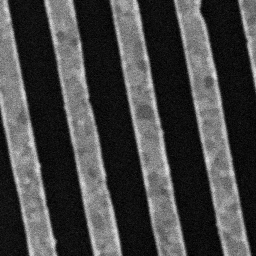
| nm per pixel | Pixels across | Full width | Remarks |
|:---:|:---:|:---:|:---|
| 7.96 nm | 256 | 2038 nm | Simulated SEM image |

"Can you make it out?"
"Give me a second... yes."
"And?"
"one or a few lines or trenches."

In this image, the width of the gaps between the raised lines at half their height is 0.31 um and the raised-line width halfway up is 0.195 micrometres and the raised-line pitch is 0.505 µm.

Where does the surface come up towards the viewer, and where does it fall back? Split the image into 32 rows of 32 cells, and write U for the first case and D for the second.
UDDDDDUUUDDDDDUUUDDDDDUUUDDDDDUU
UDDDDDUUUDDDDDUUUDDDDDUUUDDDDDUU
UDDDDDUUUDDDDDUUUDDDDDUUUDDDDDUU
UDDDDDUUUUDDDDDUUUDDDDDUUUDDDDDU
UUDDDDDUUUDDDDDUUUDDDDDUUUDDDDDU
UUDDDDDUUUDDDDDUUUDDDDDUUUDDDDDU
UUDDDDDUUUDDDDDUUUDDDDDUUUDDDDDU
UUDDDDDUUUDDDDDUUUDDDDDUUUUDDDDU
UUDDDDDUUUDDDDDUUUUDDDDDUUUDDDDD
UUUDDDDDUUDDDDDDUUUDDDDDUUUDDDDD
UUUDDDDDUUUDDDDDUUUDDDDDUUUDDDDD
UUUDDDDDUUUDDDDDUUUDDDDDUUUDDDDD
UUUDDDDDUUUDDDDDUUUDDDDDUUUDDDDD
UUUDDDDDUUUDDDDDUUUDDDDDDUUUDDDD
UUUDDDDDUUUUDDDDDUUUDDDDDUUUDDDD
DUUUDDDDDUUUDDDDDUUUDDDDDUUUDDDD
DUUUDDDDDUUUDDDDDUUUDDDDDUUUDDDD
DUUUDDDDDUUUDDDDDUUUDDDDDUUUDDDD
DUUUDDDDDUUUDDDDDUUUDDDDDDUUUDDD
DUUUDDDDDUUUUDDDDDUUUDDDDDUUUDDD
DDUUUDDDDDUUUDDDDDUUUDDDDDUUUDDD
DDUUUDDDDDUUUDDDDDUUUDDDDDUUUDDD
DDUUUDDDDDUUUDDDDDUUUDDDDDUUUDDD
DDUUUDDDDDUUUDDDDDUUUDDDDDUUUUDD
DDUUUDDDDDUUUUDDDDUUUUDDDDDUUUDD
DDDUUUDDDDDUUUDDDDDUUUDDDDDUUUDD
DDDUUUDDDDDUUUDDDDDUUUDDDDDUUUDD
DDDUUUDDDDDUUUDDDDDUUUDDDDDUUUDD
DDDUUUDDDDDUUUUDDDDUUUDDDDDUUUDD
DDDUUUUDDDDUUUUDDDDUUUUDDDDUUUUD
DDDDUUUDDDDDUUUDDDDDUUUDDDDDUUUD
DDDDUUUDDDDDUUUDDDDDUUUDDDDDUUUD